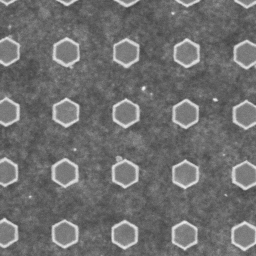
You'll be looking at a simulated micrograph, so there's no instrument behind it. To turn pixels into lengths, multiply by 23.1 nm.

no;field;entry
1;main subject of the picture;a regular array of raised bodies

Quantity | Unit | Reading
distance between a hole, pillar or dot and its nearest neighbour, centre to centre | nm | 1380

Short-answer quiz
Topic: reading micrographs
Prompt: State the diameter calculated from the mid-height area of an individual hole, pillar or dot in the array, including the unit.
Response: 26.1 px